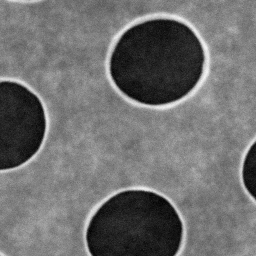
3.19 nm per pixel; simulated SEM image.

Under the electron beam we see holes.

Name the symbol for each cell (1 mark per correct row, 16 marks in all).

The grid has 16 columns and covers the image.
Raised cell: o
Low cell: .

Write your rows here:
oooooooooooooooo
oooooooo....oooo
ooooooo.....oooo
ooooooo......ooo
ooooooo......ooo
..ooooo.....oooo
...oooooo.oooooo
...ooooooooooooo
...ooooooooooooo
..oooooooooooooo
.oooooooooooooo.
ooooooooooooooo.
ooooooo...oooooo
oooooo.....ooooo
ooooo......ooooo
oooooo.....ooooo